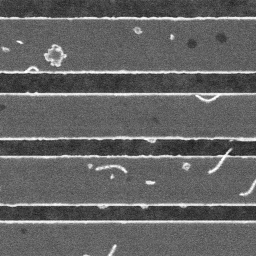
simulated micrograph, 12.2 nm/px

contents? lines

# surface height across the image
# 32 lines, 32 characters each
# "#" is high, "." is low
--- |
................................
................................
################################
################################
################################
################################
################################
################################
################################
................................
................................
................................
################################
################################
################################
################################
################################
..............................##
................................
.......##..##....#.........##...
################################
################################
################################
################################
################################
################################
................................
................................
################################
################################
################################
################################